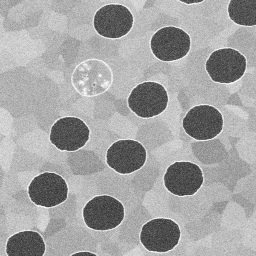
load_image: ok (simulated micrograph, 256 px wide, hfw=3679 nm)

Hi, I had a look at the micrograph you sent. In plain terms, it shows a regular array of holes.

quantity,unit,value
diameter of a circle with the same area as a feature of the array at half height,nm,545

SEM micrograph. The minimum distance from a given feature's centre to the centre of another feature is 0.86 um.